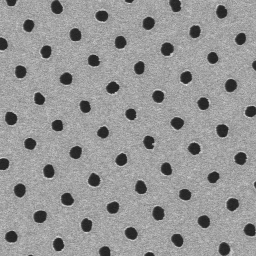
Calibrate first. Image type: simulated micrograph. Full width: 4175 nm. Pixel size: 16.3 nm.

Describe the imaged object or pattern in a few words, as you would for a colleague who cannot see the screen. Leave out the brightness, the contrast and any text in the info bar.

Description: a regular array of holes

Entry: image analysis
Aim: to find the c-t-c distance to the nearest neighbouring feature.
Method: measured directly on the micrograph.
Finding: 522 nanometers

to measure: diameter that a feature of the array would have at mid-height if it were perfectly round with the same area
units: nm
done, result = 197